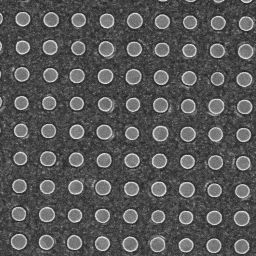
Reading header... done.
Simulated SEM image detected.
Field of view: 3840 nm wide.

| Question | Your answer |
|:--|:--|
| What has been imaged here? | a regular array of raised bodies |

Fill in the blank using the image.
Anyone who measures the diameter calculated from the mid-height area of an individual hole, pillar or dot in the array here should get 13.9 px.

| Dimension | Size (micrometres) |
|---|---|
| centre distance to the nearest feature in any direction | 0.405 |